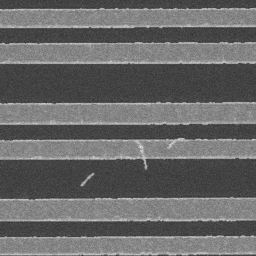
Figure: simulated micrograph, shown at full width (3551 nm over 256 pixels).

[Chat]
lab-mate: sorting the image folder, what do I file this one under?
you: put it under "lines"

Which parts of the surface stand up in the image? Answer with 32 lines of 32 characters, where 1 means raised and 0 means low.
00000000000000000000000000000000
11111111111111111111111111111111
11111111111111111111111111111111
00000000000000000000000000000000
00000000000000000000000000000000
11111111111111111111111111111111
11111111111111111111111111111111
11111111111111111111111111111111
00000000000000000000000000000000
00000000000000000000000000000000
00000000000000000000000000000000
00000000000000000000000000000000
00000000000000000000000000000000
11111111111111111111111111111111
11111111111111111111111111111111
10000000000000000010000000000000
00000000000000000000000000000000
00000000000000000000011011011001
11111111111111111111111111111111
11111111111111111111111111111111
00000000000000000000000000000000
00000000000000000000000000000000
00000000000000000000000000000000
00000000000000000000000000000000
00000000000000000000000000000000
11111111111111111111111111111111
11111111111111111111111111111111
11111110000000000000000000000000
00000000000000000000000000000000
00000000000000000000000000000000
11111111111111111111111111111111
11111111111111111111111111111111